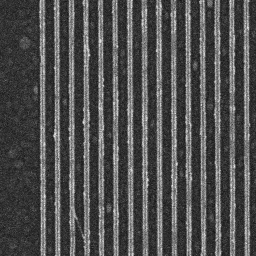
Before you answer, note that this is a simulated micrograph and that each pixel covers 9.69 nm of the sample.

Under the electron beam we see parallel lines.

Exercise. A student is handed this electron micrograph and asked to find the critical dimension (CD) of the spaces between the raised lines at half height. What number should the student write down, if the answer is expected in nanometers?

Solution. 96.9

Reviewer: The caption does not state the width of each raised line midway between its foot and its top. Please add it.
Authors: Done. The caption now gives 0.0436 microns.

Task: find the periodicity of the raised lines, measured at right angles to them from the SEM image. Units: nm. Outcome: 141